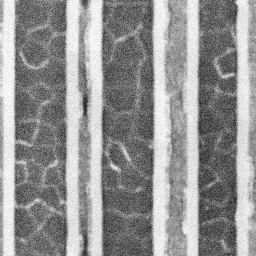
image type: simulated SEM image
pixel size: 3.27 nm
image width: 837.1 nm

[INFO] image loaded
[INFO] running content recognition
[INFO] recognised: one or a few lines or trenches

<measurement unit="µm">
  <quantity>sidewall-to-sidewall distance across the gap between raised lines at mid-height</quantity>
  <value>0.207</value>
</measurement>